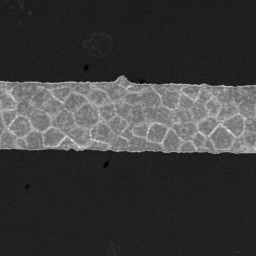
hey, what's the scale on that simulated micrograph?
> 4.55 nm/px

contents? one or a few lines or trenches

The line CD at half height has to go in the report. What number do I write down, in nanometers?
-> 303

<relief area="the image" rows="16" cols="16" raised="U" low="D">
DDDDDDDDDDDDDDDD
DDDDDDDDDDDDDDDD
DDDDDDDDDDDDDDDD
DDDDDDDDDDDDDDDD
DDDDDDDDDDDDDDDD
UUUUUUUUUUUUUUUU
UUUUUUUUUUUUUUUU
UUUUUUUUUUUUUUUU
UUUUUUUUUUUUUUUU
DDDDDDDDDDDDDUUU
DDDDDDDDDDDDDDDD
DDDDDDDDDDDDDDDD
DDDDDDDDDDDDDDDD
DDDDDDDDDDDDDDDD
DDDDDDDDDDDDDDDD
DDDDDDDDDDDDDDDD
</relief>